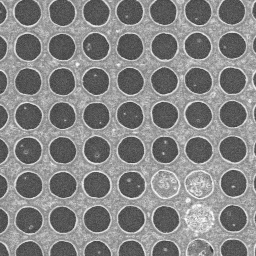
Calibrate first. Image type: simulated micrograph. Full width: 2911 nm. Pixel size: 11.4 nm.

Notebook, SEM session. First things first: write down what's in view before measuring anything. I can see a regular array of holes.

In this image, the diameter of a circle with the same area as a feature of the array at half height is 306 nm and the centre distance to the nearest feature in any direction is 33.9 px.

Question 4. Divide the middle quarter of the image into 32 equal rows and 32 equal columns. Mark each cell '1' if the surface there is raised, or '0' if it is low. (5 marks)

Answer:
11111111111111111111111111111111
01111100001111100001111000011110
00111000000111000001110000001110
00011000000110000000110000001100
00010000000110000000110000001100
00011000000110000000110000001110
00111000000111000001111000001110
01111110001111110011111100111111
11111111111111111111111111111111
11111111111111110111111100111111
00111100000111000001111000001110
00011000000110000000110000000100
00011000000110000000110000000100
00011000000010000000110000000100
00011000000111000000110000001110
00111100000111100001111000011111
11111111111111111111111111111111
11111111111111111111111111111111
01111100001111100011111100011111
00111000000111000000111000001110
00011000000111000000110000001110
00011000000010000000110000000100
00011000000110000000110000001110
00011100000111000000111000001110
00111110011111100001111100011111
11111111111111111111111111111111
11111111111111111111111111111111
00111100001111100001111111111111
00011000000111000000111111111111
00011000000111000000111111111111
00011000000010000000111111111111
00011000000111000000111111111111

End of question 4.